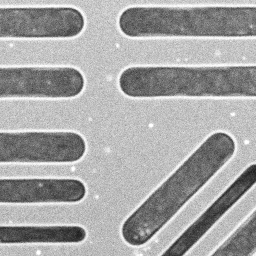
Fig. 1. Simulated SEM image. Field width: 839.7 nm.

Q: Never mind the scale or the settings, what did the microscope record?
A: groups of lines, slits or small figures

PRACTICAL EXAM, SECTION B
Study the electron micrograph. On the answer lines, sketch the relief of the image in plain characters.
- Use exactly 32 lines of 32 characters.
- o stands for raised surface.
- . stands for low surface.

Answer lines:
oooooooooooooooooooooooooooooooo
..........ooooo.................
...........oooo.................
..........ooooo.................
.........ooooooo................
oooooooooooooooooooooooooooooooo
oooooooooooooooooooooooooooooooo
oooooooooooooooooooooooooooooooo
.........ooooooo................
..........ooooo.................
..........ooooo.................
..........ooooo.................
oooooooooooooooooooooooooooooooo
oooooooooooooooooooooooooooooooo
oooooooooooooooooooooooooooooooo
oooooooooooooooooooooooooooooooo
ooo.....oooooooooooooooooooooooo
..........oooooooooooooooo...ooo
...........oooooooooooooo....ooo
..........oooooooooooooo.....ooo
ooooooooooooooooooooooo.....oooo
oooooooooooooooooooooo.....ooo..
.........oooooooooooo.....ooo...
...........ooooooooo.....ooo...o
..........ooooooooo.....oooo..oo
oooooooooooooooooo.....oooo..ooo
ooooooooooooooooo.....oooo..oooo
oooooooooooooooo.....oooo..oooo.
..........ooooo.....ooo...oooo..
...........oooo....oooo..oooo...
oooooooooooooooo..oooo..oooo....
ooooooooooooooooooooo..oooo.....